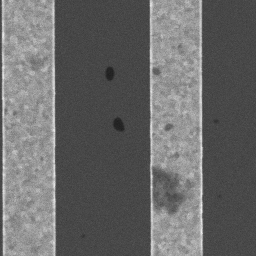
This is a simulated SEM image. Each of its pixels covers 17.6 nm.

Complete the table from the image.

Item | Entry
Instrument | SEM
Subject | wiring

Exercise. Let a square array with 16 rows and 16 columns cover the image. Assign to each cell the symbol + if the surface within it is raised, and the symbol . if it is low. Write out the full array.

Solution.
+++......++++...
+++......++++...
+++......++++...
+++......++++...
+++......++++...
+++......++++...
+++......++++...
+++......++++...
+++......++++...
+++......++++...
+++......++++...
+++......++++...
+++......++++...
+++......++++...
+++......++++...
+++......++++...